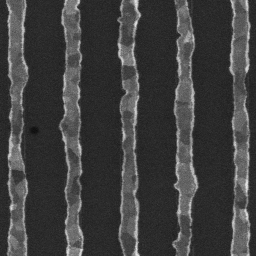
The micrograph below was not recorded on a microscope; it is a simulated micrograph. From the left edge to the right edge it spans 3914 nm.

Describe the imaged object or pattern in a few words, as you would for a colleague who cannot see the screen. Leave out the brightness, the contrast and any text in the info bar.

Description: parallel lines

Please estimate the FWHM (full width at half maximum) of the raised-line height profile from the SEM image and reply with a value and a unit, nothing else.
210 nm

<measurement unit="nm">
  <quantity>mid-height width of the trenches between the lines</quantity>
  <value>646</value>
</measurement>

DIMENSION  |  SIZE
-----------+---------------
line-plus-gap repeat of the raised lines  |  855 nanometres